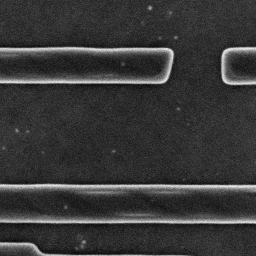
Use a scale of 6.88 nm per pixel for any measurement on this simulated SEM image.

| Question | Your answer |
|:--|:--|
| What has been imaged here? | wiring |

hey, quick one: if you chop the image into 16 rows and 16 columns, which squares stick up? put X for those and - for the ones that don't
----------------
----------------
----------------
XXXXXXXXXXX---XX
XXXXXXXXXXX---XX
----------------
----------------
----------------
----------------
----------------
----------------
----------------
XXXXXXXXXXXXXXXX
XXXXXXXXXXXXXXXX
----------------
XX--------------